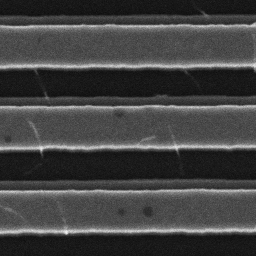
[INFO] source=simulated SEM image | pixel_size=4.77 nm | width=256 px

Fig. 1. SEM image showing lines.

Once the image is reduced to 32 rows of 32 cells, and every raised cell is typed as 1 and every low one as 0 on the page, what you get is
00000000000000000000000000000000
00000000000000000000000000000000
00000000000000000000000000000000
11111111111111111111111111111111
11111111111111111111111111111111
11111111111111111111111111111111
11111111111111111111111111111111
11111111111111111111111111111111
10000000000000000000001000000000
00000000000000000000000000000000
00000000000000000000000000000000
00000000000000000000000000000000
00000000000000000000000000000000
11111111111111111111111111111111
11111111111111111111111111111111
11111111111111111111111111111111
11111111111111111111111111111111
11111111111111111111111111111111
11111111111111110111111000001100
00000000000000000000000000000000
00000000000000000000000000000000
00000000000000000000000000000000
00000000000000000000000000000000
00000000000000000000000000000000
11111111111111111111111111111111
11111111111111111111111111111111
11111111111111111111111111111111
11111111111111111111111111111111
11111111111111111111111111111111
00000000000000000000000000000000
00000000000000000000000000000000
00000000000000000000000000000000